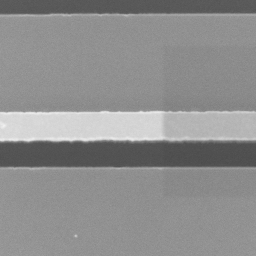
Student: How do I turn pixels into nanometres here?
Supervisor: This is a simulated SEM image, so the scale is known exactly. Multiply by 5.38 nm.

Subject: lines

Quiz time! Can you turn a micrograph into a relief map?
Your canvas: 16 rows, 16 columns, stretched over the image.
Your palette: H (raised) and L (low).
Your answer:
LLLLLLLLLLLLLLLL
HHHHHHHHHHHHHHHH
HHHHHHHHHHHHHHHH
HHHHHHHHHHHHHHHH
HHHHHHHHHHHHHHHH
HHHHHHHHHHHHHHHH
HHHHHHHHHHHHHHHH
HHHHHHHHHHHHHHHH
HHHHHHHHHHHHHHHH
LLLLLLLLLLLLLLLL
LLLLLLLLLLLLLLLL
HHHHHHHHHHHHHHHH
HHHHHHHHHHHHHHHH
HHHHHHHHHHHHHHHH
HHHHHHHHHHHHHHHH
HHHHHHHHHHHHHHHH